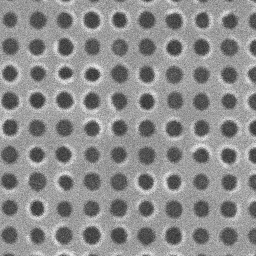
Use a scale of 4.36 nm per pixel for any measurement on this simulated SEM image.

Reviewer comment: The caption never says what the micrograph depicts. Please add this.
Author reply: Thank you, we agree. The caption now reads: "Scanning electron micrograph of a regular array of holes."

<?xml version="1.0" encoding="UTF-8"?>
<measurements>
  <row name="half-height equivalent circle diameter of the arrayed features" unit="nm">77.8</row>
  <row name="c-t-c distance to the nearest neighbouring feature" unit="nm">116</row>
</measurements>